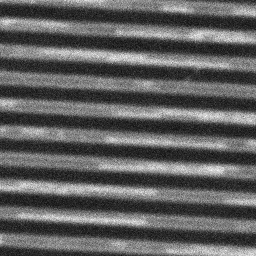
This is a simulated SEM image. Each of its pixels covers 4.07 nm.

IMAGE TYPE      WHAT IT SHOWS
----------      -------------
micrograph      parallel lines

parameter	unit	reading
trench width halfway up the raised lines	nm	62.9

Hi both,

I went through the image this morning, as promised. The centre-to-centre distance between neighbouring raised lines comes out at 26.9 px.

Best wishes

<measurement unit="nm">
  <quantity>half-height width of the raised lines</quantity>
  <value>45.2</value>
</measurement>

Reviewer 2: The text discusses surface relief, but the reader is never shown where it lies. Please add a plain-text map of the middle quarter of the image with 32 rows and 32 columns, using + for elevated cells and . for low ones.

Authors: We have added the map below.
................................
................................
................................
+++++++.........................
+++++++++++++++++++++++++.......
++++++++++++++++++++++++++++++++
..................++++++++++++++
................................
................................
................................
+++++++++.......................
+++++++++++++++++++++++++++.....
...+++++++++++++++++++++++++++++
.....................++.++++++++
................................
................................
+...............................
++++++++++++++++.++.............
++++++++++++++++++++++++++++++++
.........+++++++++++++++++++++++
...........................+++++
................................
................................
++++............................
++++++++++++++++++++++..........
++++++++++++++++++++++++++++++++
............++++++++++++++++++++
................................
................................
................................
+++++++++.......................
++++++++++++++++++++++++........